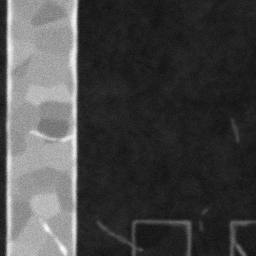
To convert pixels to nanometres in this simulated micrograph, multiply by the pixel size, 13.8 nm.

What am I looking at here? wiring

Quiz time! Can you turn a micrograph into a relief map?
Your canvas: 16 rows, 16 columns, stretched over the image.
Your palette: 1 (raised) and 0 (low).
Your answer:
0111100000000000
0111100000000000
0111100000000000
0111100000000000
0111100000000000
0111100000000000
0111100000000000
1111100000000000
1111100000000000
1111100000000000
1111100000000000
1111100000000000
0111100000000000
0111100000000000
0111100011110001
1111100011110001